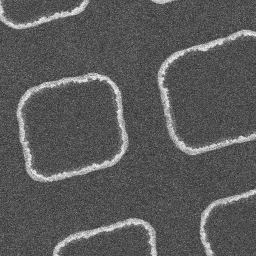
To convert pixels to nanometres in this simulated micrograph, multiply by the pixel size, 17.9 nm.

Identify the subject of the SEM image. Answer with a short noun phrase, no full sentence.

raised bodies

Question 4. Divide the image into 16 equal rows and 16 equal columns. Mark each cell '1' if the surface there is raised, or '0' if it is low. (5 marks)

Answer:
1111100000000000
0100000000000000
0000000000000011
0000000000011111
0000000000111111
0011111000111111
0111111000111111
0111111100011111
0111111100011111
0011111100000000
0011110000000000
0000000000000000
0000000000000011
0000000000000111
0000001110000111
0000111111000111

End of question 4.